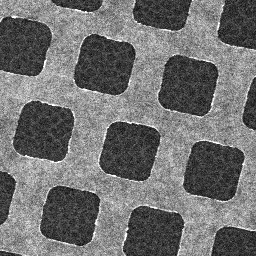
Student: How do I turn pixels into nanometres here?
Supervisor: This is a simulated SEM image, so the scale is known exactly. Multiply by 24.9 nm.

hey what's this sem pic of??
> holes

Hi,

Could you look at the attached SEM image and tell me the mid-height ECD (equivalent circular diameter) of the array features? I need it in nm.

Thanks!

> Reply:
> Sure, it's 1510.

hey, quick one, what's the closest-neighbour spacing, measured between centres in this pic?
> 2150 nanometres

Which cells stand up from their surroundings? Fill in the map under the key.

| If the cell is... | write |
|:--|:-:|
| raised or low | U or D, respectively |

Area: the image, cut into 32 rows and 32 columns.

UUUUUUUDDDDDDUUUUDDDDDDDUUUUDDDD
UUUUUUUUUUUUUUUUUDDDDDDDUUUUDDDD
DDDDUUUUUUUUUUUUUDDDDDDUUUUDDDDD
DDDDDDUUUUUUUUUUUUUUDDDUUUUDDDDD
DDDDDDDUUUUDDUUUUUUUUUUUUUUDDDDD
DDDDDUUUUUDDDDDDUUUUUUUUUUUUDDDD
DDDDDDUUUUDDDDDDDUUUUUUUUUUUUUUU
DDDDDDUUUUDDDDDDDUUUUDDDDUUUUUUU
DDDDDUUUUDDDDDDDDUUUDDDDDDDUUUUU
UUUDDUUUUDDDDDDDUUUUDDDDDUDUUUUU
UUUUUUUUUDDDDDDDUUUUDDDDDDDUUUUD
UUUUUUUUUUUUDDDUUUUUDDDDDDDUUUUD
UUUUUUUUUUUUUUUUUUUUDDDDDDDUUUUU
UUUDDDDDUUUUUUUUUUUUUDDDDDUUUUUD
UUDDDDDDDUUUUUUUUUUUUUUUDUUUUUDD
UUDDDDDDDUUUUUDDDDUUUUUUUUUUUUUD
UUDDDDDDDUUUUDDDDDDDUUUUUUUUUUUU
UUDDDDDDDUUUUDDDDDDDUUUUUUUUUUUU
UUDDDDDDDUUUUDDDDDDDUUUUDDDDDUUU
UUUDDDDDUUUUDDDDDDDDUUUUDDDDDDDU
UUUUUUUUUUUUDDDDDDDUUUUDUDDDDDUU
DUUUUUUUUUUUUDDDDDDUUUUDDDDDDDUU
DDUUUUUUUUUUUUUUDDUUUUUDDDDDDDUU
DDUUUUUDDUUUUUUUUUUUUUUDDDDDDDUU
DDUUUUDDDUUDUUUUUUUUUUUUUDDDDUUU
DUUUUDDDDUUDDUUUUUUUUUUUUUUUUUUU
DUUUUDDDDDDDUUUUDDDDDDUUUUUUUUUU
DUUUUDDDDDDDUUUUDDDDDDDUUUUUUUUU
UUUUUDDDDDDDUUUUDDDDDDDUUUUUDDUU
UUUUUDDDDDDDUUUUDDDDDDDUUUUDDDDD
UUUUUUUUUDDUUUUDDDDDDDDUUUUDDDDD
DUUUUUUUUUUUUUUDDDDDDDUUUUDDDDDD